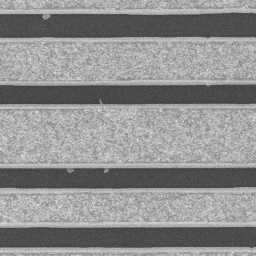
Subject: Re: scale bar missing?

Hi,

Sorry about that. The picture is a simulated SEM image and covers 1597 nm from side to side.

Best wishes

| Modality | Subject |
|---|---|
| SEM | one or a few lines or trenches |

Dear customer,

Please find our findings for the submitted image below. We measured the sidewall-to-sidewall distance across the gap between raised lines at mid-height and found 154 nm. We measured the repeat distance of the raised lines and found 73.2 pixels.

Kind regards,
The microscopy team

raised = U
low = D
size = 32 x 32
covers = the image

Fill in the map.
UUUUUUUUUUUUUUUUUUUUUUUUUUUUUUUU
DDDDDDDDDDDDDDDDUUDUUUDDDDDDDDDD
DDDDDDDDDDDDDDDDDDDDDDDDDDDDDDDD
DDDDDDDDDDDDDDDDDDDDDDDDDDDDDDDD
DDDDDDDDDDDDDDDDDDDDDDDDDDDDDDDD
UUUUUUUUUUUUUUUUUUUUUUUUUUUUUUUU
UUUUUUUUUUUUUUUUUUUUUUUUUUUUUUUU
UUUUUUUUUUUUUUUUUUUUUUUUUUUUUUUU
UUUUUUUUUUUUUUUUUUUUUUUUUUUUUUUU
UUUUUUUUUUUUUUUUUUUUUUUUUUUUUUUU
DDDDDDDDDDDDDDDDDDDDDDDDDDDDDDDD
DDDDDDDDDDDDDDDDDDDDDDDDDDDDDDDD
DDDDDDDDDDDDDDDDDDDDDDDDDDDDDDDD
UUUUUUUUUUUUUUUUUUUUUUUUUUUUUUUU
UUUUUUUUUUUUUUUUUUUUUUUUUUUUUUUU
UUUUUUUUUUUUUUUUUUUUUUUUUUUUUUUU
UUUUUUUUUUUUUUUUUUUUUUUUUUUUUUUU
UUUUUUUUUUUUUUUUUUUUUUUUUUUUUUUU
UUUUUUUUUUUUUUUUUUUUUUUUUUUUUUUU
UUUUUUUUUUUUUUUUUUUUUUUUUUUUUUUU
UUUUUUUUUUUUUUUUUUUUUUUUUUUUUUUU
DDDDDDDDDDDDDDDDDDDDDDDDDDDDDDDD
DDDDDDDDDDDDDDDDDDDDDDDDDDDDDDDD
DDDDDDDDDDDDDDDDDDDDDDDDDDDDDDDD
UUUUUUUUUUUUUUUUUUUUUUUUUUUUUUUU
UUUUUUUUUUUUUUUUUUUUUUUUUUUUUUUU
UUUUUUUUUUUUUUUUUUUUUUUUUUUUUUUU
UUUUUUUUUUUUUUUUUUUUUUUUUUUUUUUU
DDDDDDDDDDDDDDDDDDDDDDDDDDDDDDDD
DDDDDDDDDDDDDDDDDDDDDDDDDDDDDDDD
DDDDDDDDDDDDDDDDDDDDDDDDDDDDDDDD
UUUUUUUUUUUUUUUUUUUUUUUUUUUUUUUU